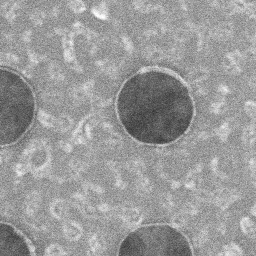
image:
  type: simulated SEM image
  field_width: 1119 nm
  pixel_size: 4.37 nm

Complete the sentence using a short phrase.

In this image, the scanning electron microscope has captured raised bodies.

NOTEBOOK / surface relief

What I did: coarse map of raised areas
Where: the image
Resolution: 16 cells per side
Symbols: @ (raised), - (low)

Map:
----------------
----------------
----------------
----------------
@--------@@-----
@@------@@@@----
@@-----@@@@@----
@@-----@@@@@----
@-------@@@-----
----------------
-@--------------
----------------
----------------
----------------
@-------@@@-----
@@-----@@@@@----